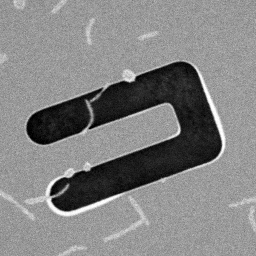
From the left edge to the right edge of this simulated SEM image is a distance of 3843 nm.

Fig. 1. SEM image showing groups of lines, slits or small figures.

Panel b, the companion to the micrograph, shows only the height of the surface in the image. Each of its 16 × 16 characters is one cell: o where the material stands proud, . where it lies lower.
oooooooooooooooo
oooooooooooooooo
oooooooooooooooo
oooooooooooooooo
ooooooooo...oooo
oooooo.......ooo
oooo.........ooo
oo.....oooo...oo
oo...oooooo...oo
oooooooo......oo
oooooo......oooo
ooo......ooooooo
ooo....ooooooooo
oooooooooooooooo
oooooooooooooooo
oooooooooooooooo